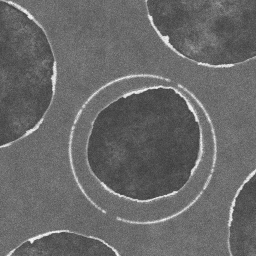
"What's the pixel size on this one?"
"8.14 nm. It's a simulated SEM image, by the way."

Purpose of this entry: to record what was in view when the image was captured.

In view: holes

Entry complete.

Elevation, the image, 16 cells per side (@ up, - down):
-@@@@@@@@-------
--@@@@@@@@------
---@@@@@@@------
---@@@@@@@@@----
---@@@@@@@@@@@@@
---@@@@@@@@@@@@@
---@@@@-----@@@@
--@@@@------@@@@
-@@@@@------@@@@
@@@@@-------@@@@
@@@@@@------@@@@
@@@@@@@-----@@@-
@@@@@@@@@@@@@@@-
@@@@@@@@@@@@@@@-
@@@@@@@@@@@@@@--
@------@@@@@@@--